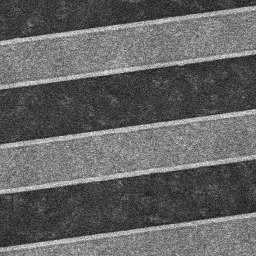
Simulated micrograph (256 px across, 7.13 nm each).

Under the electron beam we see one or a few lines or trenches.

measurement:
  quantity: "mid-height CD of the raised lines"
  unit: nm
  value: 316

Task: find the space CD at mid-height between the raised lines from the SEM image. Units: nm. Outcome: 408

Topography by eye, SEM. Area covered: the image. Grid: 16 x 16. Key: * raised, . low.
................
.........*******
.***************
**************..
*******.........
................
................
............****
.....***********
****************
***********.....
****............
................
...............*
........********
.***************